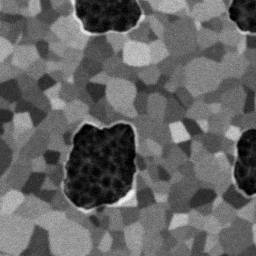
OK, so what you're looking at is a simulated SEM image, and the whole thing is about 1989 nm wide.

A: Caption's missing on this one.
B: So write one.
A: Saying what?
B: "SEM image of holes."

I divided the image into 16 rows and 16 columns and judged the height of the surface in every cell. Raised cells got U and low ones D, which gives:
UUUUUDDDDUUUUUDD
UUUUUDDDDUUUUUUD
UUUUUUUUUUUUUUUU
UUUUUUUUUUUUUUUU
UUUUUUUUUUUUUUUU
UUUUUUUUUUUUUUUU
UUUUUUUUUUUUUUUU
UUUUUUUUUUUUUUUU
UUUUUDDDUUUUUUUD
UUUUDDDDUUUUUUUD
UUUUDDDDDUUUUUUD
UUUUDDDDUUUUUUUD
UUUUDDDDUUUUUUUU
UUUUUUUUUUUUUUUU
UUUUUUUUUUUUUUUU
UUUUUUUUUUUUUUUU